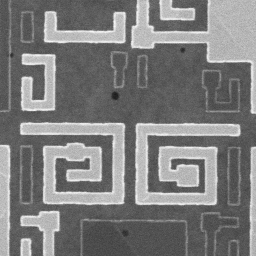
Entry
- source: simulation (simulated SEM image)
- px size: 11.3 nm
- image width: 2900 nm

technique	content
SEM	wiring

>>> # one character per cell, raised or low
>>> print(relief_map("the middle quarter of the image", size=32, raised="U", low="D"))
DDDDDDDDDDDDUUUUDDUUUDDDDDDDDDDD
DDDDDDDDDDDDDUUDDDUUUDDDDDDDDDDD
DDDDDDDDDDDDDUUDDDUUUDDDDDDDDDDD
DDDDDDDDDDDDDUUDDDUUUDDDDDDDDDDD
DDDDDDDDDDDDDUUDDDUUUDDDDDDDDDDD
DDDDDDDDDDDDDUUDDDUUUDDDDDDDDDDD
DDDDDDDDDDDDDDDDDDDDDDDDDDDDDDDD
DDDDDDDDDDDDDDDDDDDDDDDDDDDDDDDD
DDDDDDDDDDDDDDDDDDDDDDDDDDDDDDDD
DDDDDDDDDDDDDDDDDDDDDDDDDDDDDDDD
DDDDDDDDDDDDDDDDDDDDDDDDDDDDDDDD
DDDDDDDDDDDDDDDDDDDDDDDDDDDDDDDD
DDDDDDDDDDDDDDDDDDDDDDDDDDDDDDDD
DDDDDDDDDDDDDDDDDDDDDDDDDDDDDDDD
DDDDDDDDDDDDDDDDDDDDDDDDDDDDDDDD
UUUUUUUUUUUUUUUDDDUUUUUUUUUUUUUU
UUUUUUUUUUUUUUUDDDUUUUUUUUUUUUUU
UUUUUUUUUUUUUUUDDDUUUUUUUUUUUUUU
DDDDDDDDDDDDDUUDDDUUUDDDDDDDDDDD
DDDDDDDDDDDDUUUDDDUUUDDDDDDDDDDD
UUUUUDDDDDDDUUUDDDUUUDDDDDDDDDDD
UUUUUUUUUDDDUUUDDDUUUDDDUUUUUUUU
UUUUUUUUUDDDUUUDDDUUUDDDUUUUUUUU
UUUUUDUUUDDDUUUDDDUUUDDDUUUDDDDD
DDDDDDDUUDDDUUUDDDUUUDDDUUUDDDDD
DDDDDDDUUDDDUUUDDDUUUDDDUUUDUUUU
DDDDDDUUUDDDUUUDDDUUUDDDUUUDUUUU
DUUUUUUUUDDDUUUDDDUUUDDDUUUUUUUU
DUUUUUUUUDDDUUUDDDUUUDDDUUUUUUUU
DDDDDDDDDDDDUUUDDDUUUDDDDDDDUUUU
DDDDDDDDDDDDUUUDDDUUUDDDDDDDDDDD
DDDDDDDDDDDDUUUDDDUUUDDDDDDDDDDD